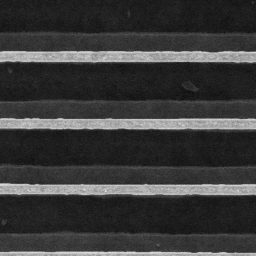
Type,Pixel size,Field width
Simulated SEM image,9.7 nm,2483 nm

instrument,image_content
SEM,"lines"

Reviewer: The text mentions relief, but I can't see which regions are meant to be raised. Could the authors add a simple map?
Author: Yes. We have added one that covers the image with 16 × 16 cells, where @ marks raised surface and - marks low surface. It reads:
----------------
----------------
@@@@@@@@@@@@@@@@
@@@@@@@@@@@@@@@@
----------------
----------------
@@@@@@@@@@@@@@@@
@@@@@@@@@@@@@@@@
----------------
----------------
@@@@@@@@@@@@-@@@
@@@@@@@@@@@@@@@@
----------------
----------------
----------------
@@@@@@@@@@@@@@@@